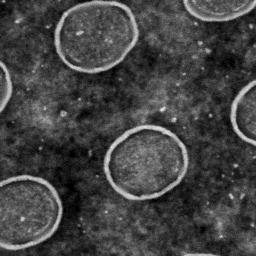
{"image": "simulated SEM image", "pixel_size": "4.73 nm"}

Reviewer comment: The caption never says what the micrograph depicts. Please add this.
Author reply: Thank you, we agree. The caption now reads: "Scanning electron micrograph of raised bodies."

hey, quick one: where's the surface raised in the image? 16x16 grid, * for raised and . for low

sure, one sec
.....***....****
....****........
....****........
....****........
................
*..............*
...............*
...............*
........***....*
.......*****....
.......*****....
***....****.....
****............
****............
***.............
................